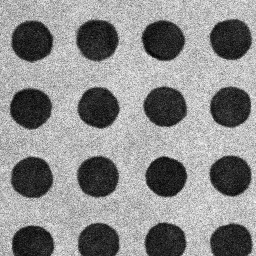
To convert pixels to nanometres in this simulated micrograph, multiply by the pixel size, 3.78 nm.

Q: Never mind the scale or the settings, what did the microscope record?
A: a regular array of holes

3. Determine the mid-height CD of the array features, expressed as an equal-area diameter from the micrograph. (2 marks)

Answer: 153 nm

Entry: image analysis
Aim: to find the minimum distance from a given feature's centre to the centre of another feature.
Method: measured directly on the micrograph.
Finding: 248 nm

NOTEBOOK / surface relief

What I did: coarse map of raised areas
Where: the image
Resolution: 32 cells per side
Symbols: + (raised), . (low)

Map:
++++++++++++++++++++++++++++++++
++++++++++++++++++++++++++++++++
++++++++++++++++++++++++++++++++
++....++++....++++....+++++....+
++....++++.....+++.....+++.....+
++.....+++.....+++.....+++.....+
++....++++....++++....+++++....+
+++..+++++++++++++++.+++++++++++
++++++++++++++++++++++++++++++++
++++++++++++++++++++++++++++++++
++++++++++++++++++++++++++++++++
++...++++++...+++++...+++++....+
++....++++.....+++.....+++.....+
+.....++++.....+++.....+++.....+
+.....++++.....+++.....++++....+
++...++++++...+++++...+++++...++
++++++++++++++++++++++++++++++++
++++++++++++++++++++++++++++++++
++++++++++++++++++++++++++++++++
++++++++++++++++++++++++++++++++
++....++++....+++++....++++....+
++....++++.....+++.....+++.....+
+......+++.....+++.....+++.....+
++....++++....+++++....++++....+
+++..+++++++.+++++++..++++++++++
++++++++++++++++++++++++++++++++
++++++++++++++++++++++++++++++++
++++++++++++++++++++++++++++++++
+++..++++++...+++++...+++++....+
++....++++.....+++.....+++.....+
++.....+++.....+++.....+++.....+
++.....+++.....+++.....++++....+